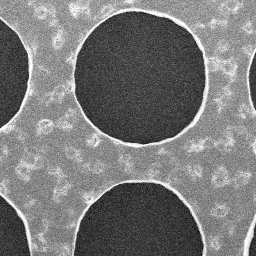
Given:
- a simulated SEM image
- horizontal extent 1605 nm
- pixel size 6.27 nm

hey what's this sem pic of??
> holes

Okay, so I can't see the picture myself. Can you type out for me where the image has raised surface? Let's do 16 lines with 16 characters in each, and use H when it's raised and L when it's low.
HHHHHHHHHHHHHHHH
HHHHHHLLLLLHHHHH
LHHHHLLLLLLLHHHH
LLHHHLLLLLLLLHHH
LLHHHLLLLLLLLHHH
LLHHHLLLLLLLLHHH
LHHHHLLLLLLLLHHH
LHHHHHLLLLLLHHHH
HHHHHHHLLLLHHHHH
HHHHHHHHHHHHHHHH
HHHHHHHHHHHHHHHH
HHHHHHHHLLHHHHHH
HHHHHHLLLLLHHHHH
LHHHHLLLLLLLHHHH
LLHHHLLLLLLLLHHH
LLHHHLLLLLLLLHHL